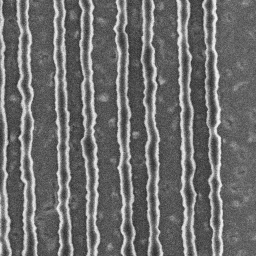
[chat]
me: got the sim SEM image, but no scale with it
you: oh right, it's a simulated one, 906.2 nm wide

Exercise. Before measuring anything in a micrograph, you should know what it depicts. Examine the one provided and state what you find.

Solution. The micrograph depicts parallel lines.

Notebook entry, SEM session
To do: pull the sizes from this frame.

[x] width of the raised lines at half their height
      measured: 35.8 nanometres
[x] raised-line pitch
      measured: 110 nanometres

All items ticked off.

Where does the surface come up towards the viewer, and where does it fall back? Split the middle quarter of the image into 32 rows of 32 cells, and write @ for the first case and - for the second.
----@@@-------@@----@@@------@@-
-----@@-------@@----@@@------@@@
-----@@-------@@----@@@------@@-
-----@@------@@@----@@@------@@-
-----@@------@@@----@@@------@@-
-----@@------@@@----@@@------@@-
-----@@------@@@----@@@------@@-
@----@@------@@@----@@@------@@-
@----@@-------@@----@@@------@@-
@----@@-------@@----@@@------@@-
@----@@-------@@----@@@------@@@
@----@@-------@@-----@@-------@@
@----@@@------@@@----@-------@@@
@----@@@------@@-----@@------@@@
@----@@@------@@----@@@------@@@
@----@@-------@@-----@@------@@@
@-----@-------@@-----@@-------@@
@----@@-------@@-----@@-------@@
@----@@-------@@-----@@@------@@
@---@@@@------@@-----@@@------@@
@----@@@------@@-----@@-------@@
@----@@@------@@----@@@-------@@
@----@@@------@@-----@@-------@@
@----@@@------@@-----@@-------@@
@-----@@------@@-----@@-------@@
@-----@@------@@@----@@@------@@
@-----@@------@@@----@@@------@@
@-----@@------@@@----@@-------@@
@-----@@------@@@----@@-------@@
@-----@@------@@@----@@-------@@
@-----@@------@@@----@@-------@@
@-----@@------@@@----@@-------@@